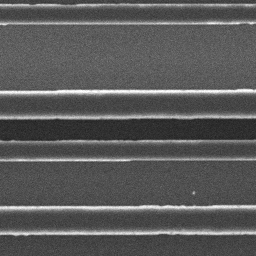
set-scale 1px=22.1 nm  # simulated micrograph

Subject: lines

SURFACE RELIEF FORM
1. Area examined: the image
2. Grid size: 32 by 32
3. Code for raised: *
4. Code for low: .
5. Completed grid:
................................
********************************
********************************
................................
................................
................................
................................
................................
................................
................................
................................
********************************
********************************
********************************
********************************
................................
................................
................................
********************************
********************************
................................
................................
................................
................................
................................
................................
********************************
********************************
********************************
................................
................................
................................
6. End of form